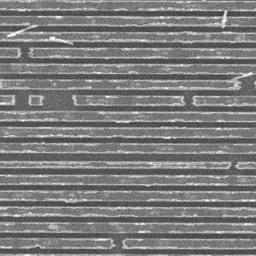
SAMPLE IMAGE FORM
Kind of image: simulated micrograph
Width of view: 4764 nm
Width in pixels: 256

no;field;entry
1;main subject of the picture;parallel lines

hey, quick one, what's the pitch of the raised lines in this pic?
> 0.295 micrometres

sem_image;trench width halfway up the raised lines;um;0.112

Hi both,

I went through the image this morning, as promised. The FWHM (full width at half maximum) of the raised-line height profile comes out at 9.88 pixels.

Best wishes